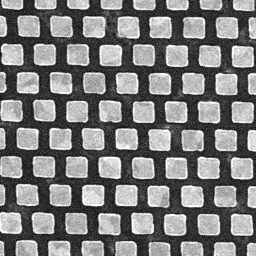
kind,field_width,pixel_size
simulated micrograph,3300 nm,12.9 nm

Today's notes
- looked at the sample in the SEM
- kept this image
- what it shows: a regular array of raised bodies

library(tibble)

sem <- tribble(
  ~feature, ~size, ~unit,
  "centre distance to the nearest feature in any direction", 32.1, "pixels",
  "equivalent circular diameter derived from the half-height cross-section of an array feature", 22.7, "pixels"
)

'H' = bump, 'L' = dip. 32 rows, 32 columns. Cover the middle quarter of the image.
LLLLLLLLLLLLLLLLLLLLLLLLLLLLHHLL
LLLLLLLLLLLLLLLLLLLLLLLLLLLLLLLL
LLLLLHHHHLLLLHHHHHLLLLLLLLLLLLHH
HHLLLHHHHHLLLHHHHHLLLLHHHHLLLLHH
HHLLLHHHHHLLLHHHHHLLLLHHHHHLLLHH
HHLLLHHHHHLLLHHHHHLLLLHHHHHLLLHH
HHLLLHHHHHLLLHHHHHLLLLHHHHHLLLHH
LLLLLLLLLLLLLLLLLLLLLLLLLLLLLLLL
LLLLLLLLLLLLLLLLLLLLLLLLLLLLLLLL
LHHHLLLLLHHHLLLLLLLLLLLLLLLLLLLL
LHHHHHLLLHHHHHLLLLHHHHLLLHHHHHLL
LHHHHHLLLHHHHHLLLLHHHHLLLLHHHHLL
LHHHHHLLLHHHHHLLLHHHHHLLLLHHHHHL
LHHHHHLLLHHHHHLLLHHHHHLLLLHHHHHL
LLLLLLLLLLLLLLLLLLLLLLLLLLLHLHLL
LLLLLLLLLLLLLLLLLLLLLLLLLLLLLLLL
HLLLLHHHLLLLLHHHHHLLLLHLLLLLLLLL
HHLLLHHHHHLLLHHHHHLLLHHHHHLLLLHH
HHLLLHHHHHLLLHHHHHLLLHHHHHLLLLHH
HHLLLHHHHHLLLHHHHHLLLHHHHHLLLLHH
HHLLLHHHHHLLLHHHHHLLLLHHHHLLLLHH
LLLLLLLLLLLLLLLLLLLLLLLLLLLLLLHL
LLLLLLLLLLLLLLLLLLLLLLLLLLLLLLLL
LHHHHLLLLHHHHLLLLLLLLLLLLLLLLLLL
LHHHHHLLLHHHHHLLLHHHHHLLLLHHHHHL
LHHHHHLLLHHHHHLLLHHHHHLLLLHHHHHL
LHHHHHLLLHHHHHLLLHHHHHLLLLHHHHHL
LHHHHHLLLHHHHHLLLHHHHHHLLLHHHHHL
LLLLLLLLLLLLLLLLLLLHHHLLLLLHLLLL
LLLLLLLLLLLLLLLLLLLLLLLLLLLLLLLL
LLLLLHHLLLLLLHHHHHLLLLLLLLLLLLLL
HHLLLHHHHHLLLHHHHHLLLHHHHHLLLLHH